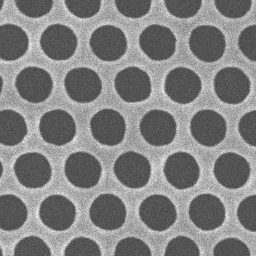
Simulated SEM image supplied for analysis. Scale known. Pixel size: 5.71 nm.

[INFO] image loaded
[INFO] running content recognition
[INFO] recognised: a regular array of holes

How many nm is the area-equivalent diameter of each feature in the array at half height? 210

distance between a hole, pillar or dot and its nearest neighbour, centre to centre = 278 nanometres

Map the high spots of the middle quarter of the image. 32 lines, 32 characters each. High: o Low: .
oooooooooooooooooooooooooooooooo
oo.....oooooooo.....ooooooo.....
o.......ooooo........ooooo......
.........oooo........oooo.......
.........oooo.........ooo.......
..........ooo.........ooo.......
.........oooo.........ooo.......
o........oooo.........oooo......
oo......oooooo.......oooooo.....
ooo...ooooooooo....ooooooooo....
oooooooooooooooooooooooooooooooo
ooooooooo....ooooooooo...ooooooo
.ooooooo......ooooooo......ooooo
..ooooo........ooooo........oooo
...ooo.........oooo.........oooo
...ooo..........ooo.........oooo
...oooo........oooo.........oooo
...oooo........oooo.........oooo
..oooooo.......ooooo........oooo
.oooooooo.....ooooooo......ooooo
ooooooooooo.oooooooooo..oooooooo
oooooooooooooooooooooooooooooooo
oo.....ooooooo.....oooooooo....o
o.......ooooo........ooooo......
.........oooo........oooo.......
.........ooo..........ooo.......
.........ooo..........ooo.......
.........oooo.........ooo.......
o........oooo........ooooo......
o........ooooo.......ooooo......
ooo.....oooooooo....ooooooo.....
oooooooooooooooooooooooooooooooo